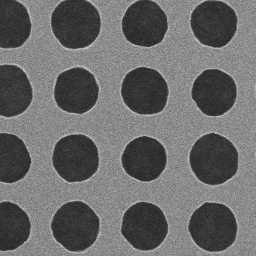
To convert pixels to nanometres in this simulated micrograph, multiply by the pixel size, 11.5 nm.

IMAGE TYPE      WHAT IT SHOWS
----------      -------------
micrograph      a regular array of holes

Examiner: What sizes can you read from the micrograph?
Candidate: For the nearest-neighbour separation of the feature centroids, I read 776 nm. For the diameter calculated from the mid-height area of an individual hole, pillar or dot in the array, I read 551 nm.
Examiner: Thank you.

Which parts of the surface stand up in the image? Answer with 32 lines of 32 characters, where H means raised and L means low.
LLLHHHHLLLLHHHHHHLLLHHHHHLLLHHHH
LLLHHHHLLLLLHHHHLLLLLHHHLLLLLHHH
LLLLHHLLLLLLLHHLLLLLLHHHLLLLLLHH
LLLLHHLLLLLLLHHLLLLLLHHHLLLLLLHH
LLLLHHHLLLLLHHHHLLLLLHHHLLLLLHHH
LLLHHHHHLLLHHHHHHLLLHHHHHLLLHHHH
HHHHHHHHHHHHHHHHHHHHHHHHHHHHHHHH
HHHHHHHHHHHHHHHHHHHHHHHHHHHHHHHH
LLHHHHHHHLHHHHHHHLLHHHHHHHHHHHHH
LLLHHHHLLLLLHHHHLLLLHHHHHLLLLHHH
LLLLHHHLLLLLHHHLLLLLLHHHLLLLLHHH
LLLLHHHLLLLLHHHLLLLLLHHHLLLLLLHH
LLLLHHHLLLLLHHHLLLLLLHHHLLLLLHHH
LLLHHHHLLLLHHHHHLLLLHHHHHLLLLHHH
LLHHHHHHHHHHHHHHHHHHHHHHHHLHHHHH
HHHHHHHHHHHHHHHHHHHHHHHHHHHHHHHH
HHHHHHHHHHHHHHHHHHHHHHHHHHHHHHHH
LLLHHHHLLLLHHHHHHLLLHHHHHLLLLHHH
LLLHHHHLLLLLHHHHLLLLHHHHLLLLLHHH
LLLLHHHLLLLLHHHLLLLLLHHHLLLLLLHH
LLLLHHHLLLLLHHHLLLLLLHHHLLLLLLHH
LLLHHHHLLLLLHHHHLLLLHHHHLLLLLLHH
LLHHHHHHLLLHHHHHHLLHHHHHHLLLLHHH
HHHHHHHHHHHHHHHHHHHHHHHHHHHHHHHH
HHHHHHHHHHHHHHHHHHHHHHHHHHHHHHHH
LLHHHHHHLLLHHHHHHLLHHHHHHLLLHHHH
LLLHHHHLLLLLHHHHLLLLHHHHLLLLLHHH
LLLLHHHLLLLLHHHLLLLLLHHHLLLLLHHH
LLLLHHLLLLLLHHHLLLLLLHHLLLLLLLHH
LLLLHHHLLLLLHHHLLLLLLHHHLLLLLLHH
LLLHHHHLLLLLHHHHLLLLHHHHHLLLLHHH
HHHHHHHHHLHHHHHHHHHHHHHHHHLHHHHH